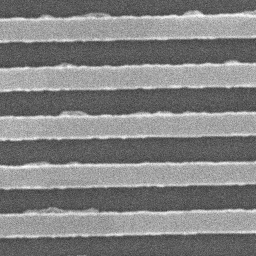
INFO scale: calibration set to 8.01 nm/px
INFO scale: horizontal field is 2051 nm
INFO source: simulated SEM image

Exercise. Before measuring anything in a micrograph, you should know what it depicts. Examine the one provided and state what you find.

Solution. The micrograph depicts lines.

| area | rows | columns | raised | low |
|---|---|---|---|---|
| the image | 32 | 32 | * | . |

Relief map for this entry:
................................
................................
********************************
********************************
********************************
................................
................................
................................
...*.***************************
********************************
********************************
................................
................................
................................
........*...********************
********************************
********************************
................................
................................
................................
.................***************
********************************
********************************
*********.......................
................................
................................
.................**..***********
********************************
********************************
***********.....................
................................
................................